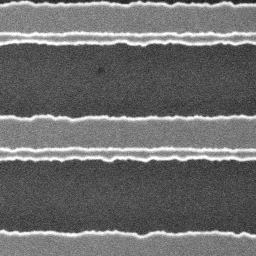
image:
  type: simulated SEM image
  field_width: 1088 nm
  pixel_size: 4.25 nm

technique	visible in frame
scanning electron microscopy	lines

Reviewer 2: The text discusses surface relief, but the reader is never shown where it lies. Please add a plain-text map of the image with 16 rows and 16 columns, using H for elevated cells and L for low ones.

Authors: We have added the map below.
HHHHHHHHHHHHHHHH
HHHHHHHHHHHHHHHH
HHHHHHHHHHHHHHHH
LLLLLLLLLLLLLLLL
LLLLLLLLLLLLLLLL
LLLLLLLLLLLLLLLL
LLLLLLLLLLLLLLLL
HHHHHHHHHHHHHHHH
HHHHHHHHHHHHHHHH
HHHHHHHHHHHHHHHH
LLLLLLLLLLLLLLLL
LLLLLLLLLLLLLLLL
LLLLLLLLLLLLLLLL
LLLLLLLLLLLLLLLL
HLHLLHHLLLLLLHLL
HHHHHHHHHHHHHHHH